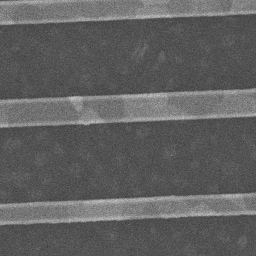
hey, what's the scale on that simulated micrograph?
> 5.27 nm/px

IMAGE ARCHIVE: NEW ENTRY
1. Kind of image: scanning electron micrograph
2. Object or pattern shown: one or a few lines or trenches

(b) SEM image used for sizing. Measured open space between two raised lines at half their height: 414 nanometers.